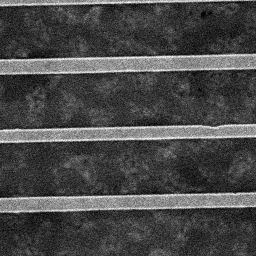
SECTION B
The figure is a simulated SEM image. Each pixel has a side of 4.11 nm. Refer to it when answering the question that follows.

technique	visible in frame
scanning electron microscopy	one or a few lines or trenches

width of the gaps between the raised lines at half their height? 229 nm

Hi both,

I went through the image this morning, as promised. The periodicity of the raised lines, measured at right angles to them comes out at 283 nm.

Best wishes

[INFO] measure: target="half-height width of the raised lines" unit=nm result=55.4